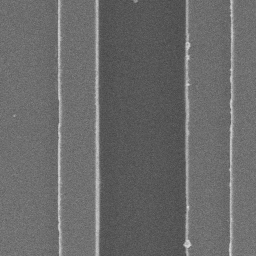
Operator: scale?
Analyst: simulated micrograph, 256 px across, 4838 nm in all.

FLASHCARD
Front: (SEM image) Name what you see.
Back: lines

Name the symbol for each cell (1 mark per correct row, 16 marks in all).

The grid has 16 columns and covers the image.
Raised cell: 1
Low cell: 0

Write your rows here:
1111110000001111
1111110000001111
1111110000001111
1111110000001111
1111110000001111
1111110000001111
1111110000001111
1111110000001111
1111110000001111
1111110000001111
1111110000001111
1111110000001111
1111110000001111
1111110000001111
1111110000001111
1111110000001111